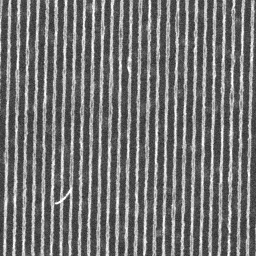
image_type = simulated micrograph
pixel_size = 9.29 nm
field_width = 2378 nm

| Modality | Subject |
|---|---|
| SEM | parallel lines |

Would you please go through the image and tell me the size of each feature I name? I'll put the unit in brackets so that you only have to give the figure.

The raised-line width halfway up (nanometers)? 18.6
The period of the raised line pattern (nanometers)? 86.8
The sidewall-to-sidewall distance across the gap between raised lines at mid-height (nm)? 65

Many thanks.